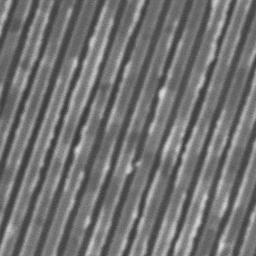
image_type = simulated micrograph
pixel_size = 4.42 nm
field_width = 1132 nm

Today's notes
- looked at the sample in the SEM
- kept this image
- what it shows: parallel lines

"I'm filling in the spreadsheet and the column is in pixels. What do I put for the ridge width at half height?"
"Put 12.9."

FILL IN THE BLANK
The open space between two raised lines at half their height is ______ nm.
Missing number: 36.5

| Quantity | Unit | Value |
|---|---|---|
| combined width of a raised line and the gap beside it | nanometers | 91.6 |